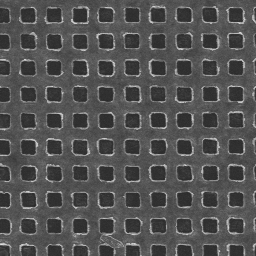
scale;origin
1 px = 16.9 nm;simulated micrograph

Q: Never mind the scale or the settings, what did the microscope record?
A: a regular array of holes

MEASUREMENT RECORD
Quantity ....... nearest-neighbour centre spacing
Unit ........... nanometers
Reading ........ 435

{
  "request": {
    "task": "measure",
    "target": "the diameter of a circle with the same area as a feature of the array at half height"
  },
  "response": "273 nm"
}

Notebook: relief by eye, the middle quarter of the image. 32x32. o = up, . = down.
oo....oo....ooo....oo.....oo....
oo....oo....ooo....ooo....oo....
oo....ooo...ooo....ooo...ooo....
oooooooooooooooooooooooooooooooo
oooooooooooooooooooooooooooooooo
ooooooooo..ooooooooooo.ooooooooo
oo....oo....ooo....ooo...ooo....
oo....oo....ooo....ooo....oo....
oo....oo....ooo....ooo....oo....
ooo..ooooo..oooo...ooooooooooooo
oooooooooooooooooooooooooooooooo
oooooooooooooooooooooooooooooooo
oo....ooo...ooo....ooo...ooo....
oo....oo.....oo....ooo....oo....
oo....ooo....oo....ooo....oo....
oo....ooo....oo....ooo...ooo....
oooooooooooooooooooooooooooooooo
oooooooooooooooooooooooooooooooo
oooooooooooooooooooooooooooooooo
oo....oo....ooo....ooo...ooo....
oo....oo.....oo....ooo....oo....
oo....ooo...ooo....ooo....oo....
ooo...ooo...oooo...ooo...oooo...
oooooooooooooooooooooooooooooooo
oooooooooooooooooooooooooooooooo
ooooooooo...oooo..oooo...oooo..o
oo....oo.....oo....ooo....oo....
oo....ooo....oo....ooo....oo....
oo....ooo....oo....ooo...ooo....
oooooooooooooooooooooooooooooooo
oooooooooooooooooooooooooooooooo
oooooooooooooooooooooooooooooooo